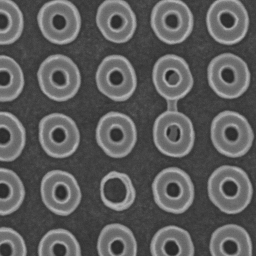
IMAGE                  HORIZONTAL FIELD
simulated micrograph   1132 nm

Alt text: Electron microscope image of a regular array of ring-shaped raised bodies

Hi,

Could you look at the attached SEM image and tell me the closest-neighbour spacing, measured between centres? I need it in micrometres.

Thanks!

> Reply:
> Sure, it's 0.249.